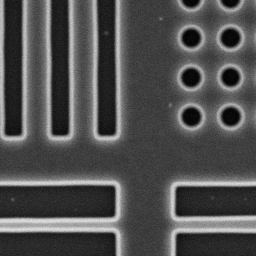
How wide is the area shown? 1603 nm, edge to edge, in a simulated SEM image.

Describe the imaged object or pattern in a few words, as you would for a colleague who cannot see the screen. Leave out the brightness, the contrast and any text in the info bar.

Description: groups of lines, slits or small figures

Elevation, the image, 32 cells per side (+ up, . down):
...+++...+++...++++++++..+++..++
...+++...+++...+++++++++++++++++
...+++...+++...+++++++++++++++++
...+++...+++...+++++++++++++.+++
...+++...+++...++++++++..+++..++
...+++...+++...++++++++..+++..++
...+++...+++...+++++++++++++++++
...+++...+++...+++++++++++++++++
...+++...+++...++++++++.++++.+++
...+++...+++...++++++++..+++..++
...+++...+++...++++++++..+++..++
...+++...+++...+++++++++++++++++
...+++...+++...+++++++++++++++++
...+++...+++...++++++++..+++..++
...+++...+++...++++++++..+++..++
...+++...+++...++++++++..+++..++
...+++...+++...+++++++++++++++++
++++++++++++++++++++++++++++++++
++++++++++++++++++++++++++++++++
++++++++++++++++++++++++++++++++
++++++++++++++++++++++++++++++++
++++++++++++++++++++++++++++++++
++++++++++++++++++++++++++++++++
...............+++++++..........
...............+++++++..........
...............+++++++..........
...............+++++++..........
.............+++++++++++++++++++
++++++++++++++++++++++++++++++++
...............+++++++..........
...............+++++++..........
...............+++++++..........